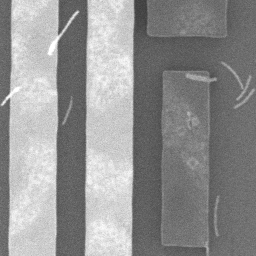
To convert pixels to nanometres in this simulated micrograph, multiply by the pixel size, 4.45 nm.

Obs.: groups of lines, slits or small figures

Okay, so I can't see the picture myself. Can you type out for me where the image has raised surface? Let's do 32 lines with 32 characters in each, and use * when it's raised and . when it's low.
..*****....******.**********....
..*****....******.**********....
..*****....******.**********....
..*****....******.**********....
..*****....******...*.....**....
..*****....******...............
..*****....******...............
..*****....******...............
..*****....******...............
.******....******...******......
.******....******...******......
.******....******...******......
.******....******...******......
.******....******...******......
.******....******...******......
.******....******...******......
.******....*****....******......
.******....*****....******......
.******....*****....******......
.******....*****....******......
.******....*****....******......
.******....******...******......
.******....*****....******......
.******....*****....******......
.******....*****....******......
.******....*****....******......
.******....*****....******......
.******....*****....******......
.******....*****....******......
.******....*****....******......
.******....*****....******......
.******....*****................